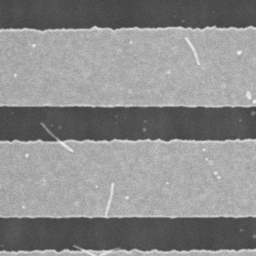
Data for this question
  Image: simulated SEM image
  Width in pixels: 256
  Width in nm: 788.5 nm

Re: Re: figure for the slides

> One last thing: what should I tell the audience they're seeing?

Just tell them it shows lines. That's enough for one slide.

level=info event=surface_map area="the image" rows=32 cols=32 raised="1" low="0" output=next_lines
00000000000000000000000000000000
00000000000000000000000000000000
00000000000000000000000000000000
00000000000100001000111000100011
11111111111111111111111111111111
11111111111111111111111111111111
11111111111111111111111111111111
11111111111111111111111111111111
11111111111111111111111111111111
11111111111111111111111111111111
11111111111111111111111111111111
11111111111111111111111111111111
11111111111111111111111111111111
00000000000000000000000000000000
00000000000000000000000000000000
00000000000000000000000000000000
00000000000000000000000000000000
00000000000000100010000000000001
11111111111111111111111111111111
11111111111111111111111111111111
11111111111111111111111111111111
11111111111111111111111111111111
11111111111111111111111111111111
11111111111111111111111111111111
11111111111111111111111111111111
11111111111111111111111111111111
11111111111111111111111111111111
00000000000000000000000000000000
00000000000000000000000000000000
00000000000000000000000000000000
00000000000000000000000000000000
11111111111111111111111111111111